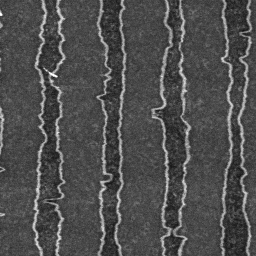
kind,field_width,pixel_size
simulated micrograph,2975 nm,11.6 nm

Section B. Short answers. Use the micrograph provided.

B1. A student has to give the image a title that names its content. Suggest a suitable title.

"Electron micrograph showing one or a few lines or trenches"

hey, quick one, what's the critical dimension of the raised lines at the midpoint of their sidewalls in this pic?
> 218 nm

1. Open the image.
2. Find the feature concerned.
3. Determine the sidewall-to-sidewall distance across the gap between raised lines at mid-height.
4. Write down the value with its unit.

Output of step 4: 505 nanometres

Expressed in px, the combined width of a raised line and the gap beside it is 62.1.